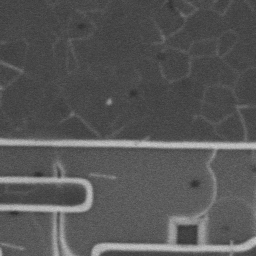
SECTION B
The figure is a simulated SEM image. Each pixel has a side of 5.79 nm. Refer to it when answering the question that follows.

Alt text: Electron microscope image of wiring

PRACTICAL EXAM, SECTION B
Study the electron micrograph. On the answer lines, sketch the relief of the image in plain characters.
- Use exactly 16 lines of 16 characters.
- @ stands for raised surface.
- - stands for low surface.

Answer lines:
@@@@@@@@@@@@@@@@
@@@@@@@@@@@@@@@@
@@@@@@@@@@@@@@@@
@@@@@@@@@@@@@@@@
@@@@@@@@@@@@@@@@
@@@@@@@@@@@@@@@@
@@@@@@@@@@@@@@@@
@@@@@@@@@@@@@@@@
@@@@@@@@@@@@@@@@
----------------
----------------
@@@@@-----------
@@@@@@----------
----------------
----------------
------@@@@@---@@